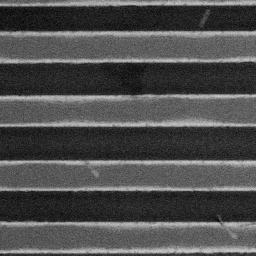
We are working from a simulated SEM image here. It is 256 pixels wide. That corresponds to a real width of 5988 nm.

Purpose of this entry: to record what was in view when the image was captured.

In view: lines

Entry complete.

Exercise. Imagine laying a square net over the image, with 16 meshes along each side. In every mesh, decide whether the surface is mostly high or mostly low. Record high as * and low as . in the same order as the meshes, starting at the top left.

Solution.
................
................
****************
****************
................
................
****************
****************
................
................
****************
****************
................
................
****************
****************